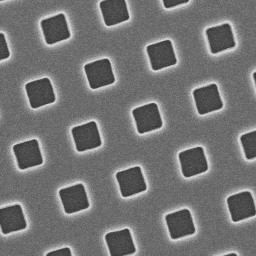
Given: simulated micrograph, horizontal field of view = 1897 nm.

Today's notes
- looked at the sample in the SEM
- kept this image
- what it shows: a regular array of holes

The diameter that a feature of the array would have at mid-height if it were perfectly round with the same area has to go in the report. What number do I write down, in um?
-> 0.219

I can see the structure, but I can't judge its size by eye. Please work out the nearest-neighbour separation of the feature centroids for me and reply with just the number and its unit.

459 nanometers